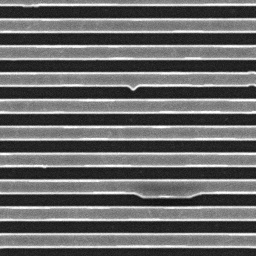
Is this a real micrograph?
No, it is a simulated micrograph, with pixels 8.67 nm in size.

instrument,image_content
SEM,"parallel lines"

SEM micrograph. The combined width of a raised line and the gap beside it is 26.9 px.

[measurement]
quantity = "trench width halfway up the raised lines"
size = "116 nm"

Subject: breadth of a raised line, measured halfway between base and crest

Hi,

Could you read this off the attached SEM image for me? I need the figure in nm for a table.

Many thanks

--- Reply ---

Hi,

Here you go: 116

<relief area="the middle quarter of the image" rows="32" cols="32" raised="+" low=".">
................................
................................
++++++++++++++++++++++++++++++++
++++++++++++++++++++++++++++++++
++++++++++++++++++++++++++++++++
................+++.............
................................
................................
................................
++++++++++++++++++++++++++++++++
++++++++++++++++++++++++++++++++
++++++++++++++++++++++++++++++++
................................
................................
................................
................................
++++++++++++++++++++++++++++++++
++++++++++++++++++++++++++++++++
++++++++++++++++++++++++++++++++
................................
................................
................................
++++++++++++++++++++++++++++++++
++++++++++++++++++++++++++++++++
++++++++++++++++++++++++++++++++
++++++++++++++++++++++++++++++++
................................
................................
................................
++++++++++++++++++++++++++++++++
++++++++++++++++++++++++++++++++
++++++++++++++++++++++++++++++++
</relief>